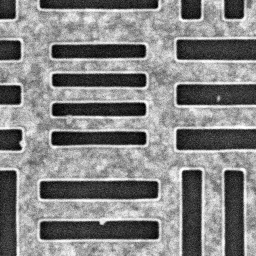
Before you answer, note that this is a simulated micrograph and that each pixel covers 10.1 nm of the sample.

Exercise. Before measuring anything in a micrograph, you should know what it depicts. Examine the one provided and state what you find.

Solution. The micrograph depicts groups of lines, slits or small figures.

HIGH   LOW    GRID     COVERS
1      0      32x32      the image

00111000000000000000110001110001
00111111111111111111110001110001
00111111111111111111111001111011
11111111111111111111111111111111
11111111111111111111111111111111
00011110000000000011110000000000
00011100000000000011110000000000
00111110000000111111110000000000
11111111111111111111111111111111
11111100000000000011111111111111
00111100000000000011110000000000
00011111111111111111110000000000
00011111111111111111110000000000
11111100000000000011111111111111
11111110100000000011111111111111
11111111111111111111111111111111
00011110000000000011110000000000
00011100000000000011110000000000
00011111111111111111110000000000
11111111111111111111111111111111
11111111111111111111111111111111
00111111111111111111111001110011
00111000000000000001111001110001
00111000000000000000111001110001
00111000000000000000111001110001
00111111111111111111111001110001
00111111111111111111111001110001
00111100000011000001111001110001
00111000000000000000111001110001
00111000000000000000111001110001
00111111111111111111111001110001
00111111111111111111111001110001